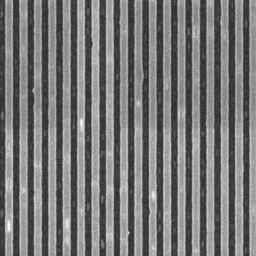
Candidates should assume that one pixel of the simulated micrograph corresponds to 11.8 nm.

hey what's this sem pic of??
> parallel lines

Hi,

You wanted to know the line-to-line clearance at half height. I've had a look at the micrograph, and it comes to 77.8 nanometres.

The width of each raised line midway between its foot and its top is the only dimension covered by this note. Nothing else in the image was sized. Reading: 88.1 nm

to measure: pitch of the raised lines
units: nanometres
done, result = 169